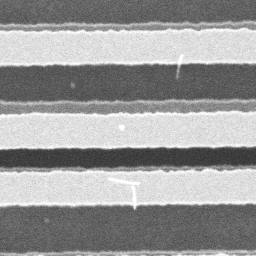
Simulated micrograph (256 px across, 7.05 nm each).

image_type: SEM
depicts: lines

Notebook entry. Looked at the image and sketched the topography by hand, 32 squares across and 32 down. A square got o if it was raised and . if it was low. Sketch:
................................
................................
................................
oooooooooooooooooooooooooooooooo
oooooooooooooooooooooooooooooooo
oooooooooooooooooooooooooooooooo
oooooooooooooooooooooooooooooooo
oooooooooooooooooooooooooooooooo
................................
................................
................................
................................
................................
oooooooooooooooooooooooooooooooo
oooooooooooooooooooooooooooooooo
oooooooooooooooooooooooooooooooo
oooooooooooooooooooooooooooooooo
oooooooooooooooooooooooooooooooo
ooooooo.o.o.ooo.................
................................
................................
oooooooooooooooooooooooooooooooo
oooooooooooooooooooooooooooooooo
oooooooooooooooooooooooooooooooo
oooooooooooooooooooooooooooooooo
ooooooooooooooooooooo...o.......
................................
................................
................................
................................
................................
.............................oo.